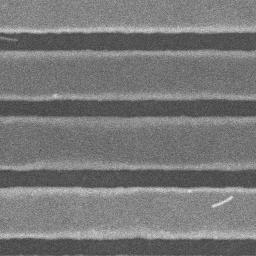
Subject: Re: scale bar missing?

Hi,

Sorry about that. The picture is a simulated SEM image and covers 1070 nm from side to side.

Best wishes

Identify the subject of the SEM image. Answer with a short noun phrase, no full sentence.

lines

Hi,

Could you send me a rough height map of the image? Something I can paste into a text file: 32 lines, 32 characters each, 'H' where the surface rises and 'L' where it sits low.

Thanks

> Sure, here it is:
HHHHHHHHHHHHHHHHHHHHHHHHHHHHHHHH
HHHHHHHHHHHHHHHHHHHHHHHHHHHHHHHH
HHHHHHHHHHHHHHHHHHHHHHHHHHHHHHHH
HHHHHHHHHHHHHHHHHHHHHHHHHHHHHHHH
LLLLLLLLLLLLLLLLLLLLLLLLLLLLLLLL
LLLLLLLLLLLLLLLLLLLLLLLLLLLLLLLL
HHHHHHHHHHHHHHHHHHHHHHHHHHHHHHHH
HHHHHHHHHHHHHHHHHHHHHHHHHHHHHHHH
HHHHHHHHHHHHHHHHHHHHHHHHHHHHHHHH
HHHHHHHHHHHHHHHHHHHHHHHHHHHHHHHH
HHHHHHHHHHHHHHHHHHHHHHHHHHHHHHHH
HHHHHHHHHHHHHHHHHHHHHHHHHHHHHHHH
LLLLHHLLLLLLLLLLLLLLLLLLLLLLLLLL
LLLLLLLLLLLLLLLLLLLLLLLLLLLLLLLL
LLLLLLLLLLLLLLLLLLLLLLLLLLLLLLLL
HHHHHHHHHHHHHHHHHHHHHHHHHHHHHHHH
HHHHHHHHHHHHHHHHHHHHHHHHHHHHHHHH
HHHHHHHHHHHHHHHHHHHHHHHHHHHHHHHH
HHHHHHHHHHHHHHHHHHHHHHHHHHHHHHHH
HHHHHHHHHHHHHHHHHHHHHHHHHHHHHHHH
HHHHHHHHHHHHHHHHHHHHHHHHHHHHHHHH
LLLLLLLLLLLLLLLLLLLLLLLLLLLLLLLL
LLLLLLLLLLLLLLLLLLLLLLLLLLLLLLLL
LLLLLLLLLLLLLLLLHHLLLHLLLHHLLLLL
HHHHHHHHHHHHHHHHHHHHHHHHHHHHHHHH
HHHHHHHHHHHHHHHHHHHHHHHHHHHHHHHH
HHHHHHHHHHHHHHHHHHHHHHHHHHHHHHHH
HHHHHHHHHHHHHHHHHHHHHHHHHHHHHHHH
HHHHHHHHHHHHHHHHHHHHHHHHHHHHHHHH
HHHHHHHHHHHHHHHHHHHHHHHHHHHHHHHH
LLLLLLLLLLLLLLLLLLLLLLLLLLLLLLLL
LLLLLLLLLLLLLLLLLLLLLLLLLLLLLLLL